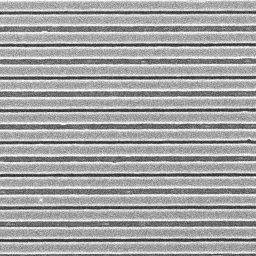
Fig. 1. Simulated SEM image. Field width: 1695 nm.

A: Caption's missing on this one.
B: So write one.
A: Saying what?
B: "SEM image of parallel lines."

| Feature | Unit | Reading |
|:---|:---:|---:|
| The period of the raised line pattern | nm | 108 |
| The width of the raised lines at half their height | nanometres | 72.8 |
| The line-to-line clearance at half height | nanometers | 28.1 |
